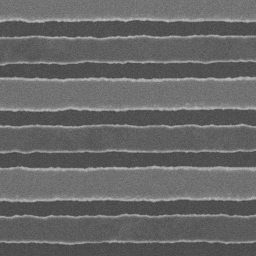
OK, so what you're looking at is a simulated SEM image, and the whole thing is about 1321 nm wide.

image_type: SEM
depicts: lines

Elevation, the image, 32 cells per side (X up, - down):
XXXXXXXXXXXXXXXXXXXXXXXXXXXXXXXX
XXXXXXXXXXXXXXXXXXXXXXXXXXXXXXXX
XXXXXXXXXXXXXXXXXXXXXXXXXXXXXXXX
--------------------------------
-----------------X------XXXX----
XXXXXXXXXXXXXXXXXXXXXXXXXXXXXXXX
XXXXXXXXXXXXXXXXXXXXXXXXXXXXXXXX
XXXXXXXXXXXXXXXXXXXXXXXXXXXXXXXX
--------------------------------
--------------------------------
XXXXXXXXXXXXXXXXXXXXXXXXXXXXXXXX
XXXXXXXXXXXXXXXXXXXXXXXXXXXXXXXX
XXXXXXXXXXXXXXXXXXXXXXXXXXXXXXXX
XXXXXXXXXXXXXXXXXXXXXXXXXXXXXXXX
--------------------------------
--------------------------------
XXXXXXXXXXXXXXXXXXXXXXXXXXXXXXXX
XXXXXXXXXXXXXXXXXXXXXXXXXXXXXXXX
XXXXXXXXXXXXXXXXXXXXXXXXXXXXXXXX
--------------------------------
--------------------------------
XXXXXXXXXXXXXXXXXXXXXXXXXXXXXXXX
XXXXXXXXXXXXXXXXXXXXXXXXXXXXXXXX
XXXXXXXXXXXXXXXXXXXXXXXXXXXXXXXX
XXXXXXXXXXXXXXXXXXXXXXXXXXXXXXXX
--------------------------------
--------------------------------
XXXXXXXXXXXXXXXXXXXXXXXXXXXXXXXX
XXXXXXXXXXXXXXXXXXXXXXXXXXXXXXXX
XXXXXXXXXXXXXXXXXXXXXXXXXXXXXXXX
--------X-----------------------
--------------------------------